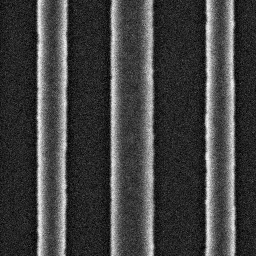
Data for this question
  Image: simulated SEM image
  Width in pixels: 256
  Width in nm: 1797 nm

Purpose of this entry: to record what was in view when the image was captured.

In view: lines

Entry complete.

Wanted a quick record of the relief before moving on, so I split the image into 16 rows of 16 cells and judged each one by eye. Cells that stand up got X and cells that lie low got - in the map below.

--XX---XX----XX-
--XX---XX----XX-
--XX---XX----XX-
--XX---XX----XX-
--XX---XX----XX-
--XX---XX----XX-
--XX---XX----XX-
--XX---XX----XX-
--XX---XX----XX-
--XX---XX----XX-
--XX---XX----XX-
--XX---XX----XX-
--XX---XX----XX-
--XX---XX----XX-
--XX---XX----XX-
--XX---XXX---XX-